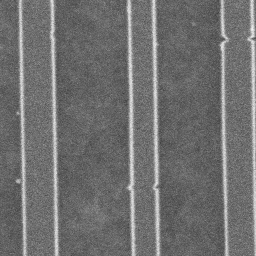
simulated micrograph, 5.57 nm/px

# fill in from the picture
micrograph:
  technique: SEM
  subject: one or a few lines or trenches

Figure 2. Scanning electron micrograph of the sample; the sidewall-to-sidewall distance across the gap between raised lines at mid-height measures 398 nm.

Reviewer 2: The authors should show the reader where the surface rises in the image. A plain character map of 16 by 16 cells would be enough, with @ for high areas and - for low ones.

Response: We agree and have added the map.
-@@-----@@----@@
-@@-----@@----@@
-@@-----@@----@@
-@@-----@@----@@
-@@-----@@----@@
-@@-----@@----@@
-@@-----@@----@@
-@@-----@@----@@
-@@-----@@----@@
-@@-----@@----@@
-@@-----@@----@@
-@@-----@@----@@
-@@-----@@----@@
-@@-----@@----@@
--@@----@@----@@
--@@----@@----@@